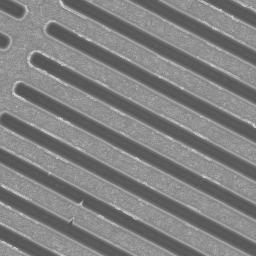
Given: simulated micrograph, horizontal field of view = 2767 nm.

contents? parallel lines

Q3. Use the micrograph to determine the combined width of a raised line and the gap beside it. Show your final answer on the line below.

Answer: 368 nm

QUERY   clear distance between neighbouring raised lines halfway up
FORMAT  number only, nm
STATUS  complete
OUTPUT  128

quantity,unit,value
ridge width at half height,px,22.6